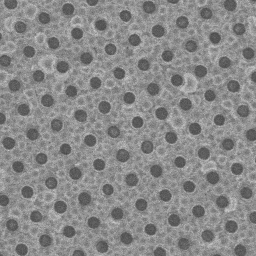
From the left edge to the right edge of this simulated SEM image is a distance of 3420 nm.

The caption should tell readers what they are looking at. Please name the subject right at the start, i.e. a regular array of holes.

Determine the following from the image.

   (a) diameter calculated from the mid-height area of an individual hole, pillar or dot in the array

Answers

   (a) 0.173 um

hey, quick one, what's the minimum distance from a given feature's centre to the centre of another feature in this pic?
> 25.4 pixels